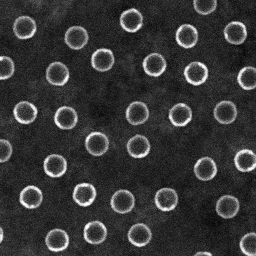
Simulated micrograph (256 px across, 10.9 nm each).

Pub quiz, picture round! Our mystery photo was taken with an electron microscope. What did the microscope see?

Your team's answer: a regular array of raised bodies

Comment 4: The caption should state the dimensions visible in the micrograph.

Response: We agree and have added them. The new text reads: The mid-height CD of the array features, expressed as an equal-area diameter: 241 nm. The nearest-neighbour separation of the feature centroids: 435 nanometers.